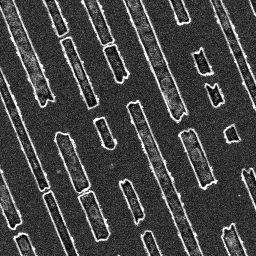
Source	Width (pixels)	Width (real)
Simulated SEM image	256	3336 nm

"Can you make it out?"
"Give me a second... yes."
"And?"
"parallel lines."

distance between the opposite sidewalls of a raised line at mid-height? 349 nanometres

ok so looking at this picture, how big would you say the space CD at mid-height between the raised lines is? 0.149 micrometres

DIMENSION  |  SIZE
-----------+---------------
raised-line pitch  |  38.4 pixels